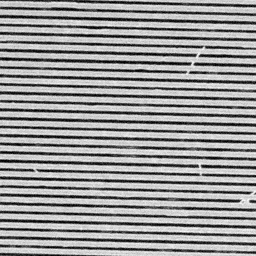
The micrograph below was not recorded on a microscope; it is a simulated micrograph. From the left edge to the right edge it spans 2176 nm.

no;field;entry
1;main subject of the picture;parallel lines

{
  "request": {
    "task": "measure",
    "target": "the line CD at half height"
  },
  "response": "42.5 nanometers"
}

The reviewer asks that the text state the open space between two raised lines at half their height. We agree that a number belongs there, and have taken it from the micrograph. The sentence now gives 31.9 nanometers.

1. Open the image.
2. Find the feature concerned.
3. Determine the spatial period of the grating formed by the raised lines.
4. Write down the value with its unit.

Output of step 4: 72.2 nm